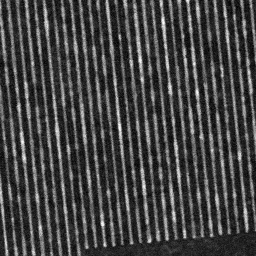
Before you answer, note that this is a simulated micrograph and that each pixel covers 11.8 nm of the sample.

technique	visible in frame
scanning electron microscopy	parallel lines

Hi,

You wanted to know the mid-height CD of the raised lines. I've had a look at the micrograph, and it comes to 20.5 nanometres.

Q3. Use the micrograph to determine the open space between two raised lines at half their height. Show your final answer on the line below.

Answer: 82.1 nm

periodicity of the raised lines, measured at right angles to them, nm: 105